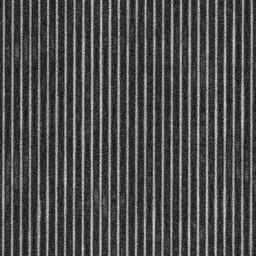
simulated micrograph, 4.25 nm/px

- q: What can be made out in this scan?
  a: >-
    parallel lines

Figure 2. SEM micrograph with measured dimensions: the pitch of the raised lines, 37.6 nanometers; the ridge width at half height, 8 nanometers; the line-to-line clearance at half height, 29.2 nm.